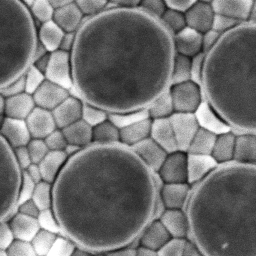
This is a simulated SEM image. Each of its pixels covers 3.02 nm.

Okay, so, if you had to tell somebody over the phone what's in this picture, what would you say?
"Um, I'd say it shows raised bodies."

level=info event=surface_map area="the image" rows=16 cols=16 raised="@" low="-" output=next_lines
@@--------------
@@---@@@@@------
@@---@@@@@@---@@
@@---@@@@@@--@@@
@----@@@@@@--@@@
-----@@@@@---@@@
------@@@----@@@
-------------@@@
----------------
@----@@@--------
@---@@@@@-----@@
@--@@@@@@@---@@@
@--@@@@@@@--@@@@
----@@@@@---@@@@
----@@@@@---@@@@
------@-----@@@@